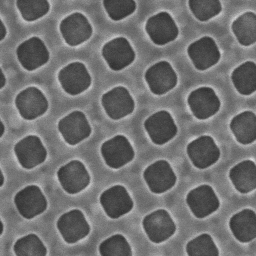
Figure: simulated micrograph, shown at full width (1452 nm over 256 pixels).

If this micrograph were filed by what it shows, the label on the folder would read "a regular array of holes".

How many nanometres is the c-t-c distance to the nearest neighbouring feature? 279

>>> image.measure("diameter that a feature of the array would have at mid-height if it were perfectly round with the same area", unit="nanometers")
186